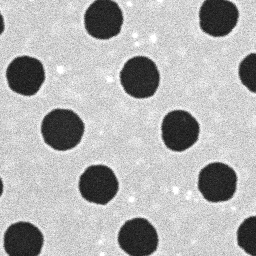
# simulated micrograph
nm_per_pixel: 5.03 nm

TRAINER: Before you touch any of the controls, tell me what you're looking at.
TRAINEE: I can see holes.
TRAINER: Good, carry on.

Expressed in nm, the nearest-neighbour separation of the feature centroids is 328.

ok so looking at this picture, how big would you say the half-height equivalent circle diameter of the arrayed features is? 206 nm